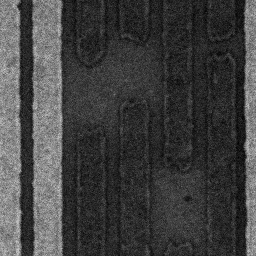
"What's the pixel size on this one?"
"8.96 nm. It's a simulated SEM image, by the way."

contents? parallel lines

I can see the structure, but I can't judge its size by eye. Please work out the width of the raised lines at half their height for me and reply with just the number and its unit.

26.9 pixels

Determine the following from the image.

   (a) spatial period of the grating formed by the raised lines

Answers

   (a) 0.391 um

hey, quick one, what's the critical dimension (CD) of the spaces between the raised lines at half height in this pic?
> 137 nm